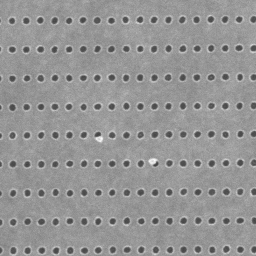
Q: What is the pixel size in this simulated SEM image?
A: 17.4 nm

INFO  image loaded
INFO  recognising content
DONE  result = a regular array of holes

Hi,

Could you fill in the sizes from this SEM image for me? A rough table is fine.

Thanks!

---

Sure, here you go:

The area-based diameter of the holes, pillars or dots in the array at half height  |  6.86 pixels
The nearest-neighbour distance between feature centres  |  14 px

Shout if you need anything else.